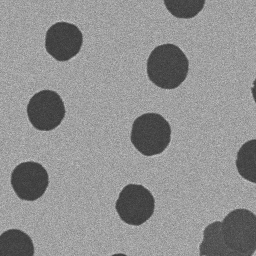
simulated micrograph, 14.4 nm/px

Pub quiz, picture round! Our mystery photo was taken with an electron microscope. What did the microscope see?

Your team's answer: holes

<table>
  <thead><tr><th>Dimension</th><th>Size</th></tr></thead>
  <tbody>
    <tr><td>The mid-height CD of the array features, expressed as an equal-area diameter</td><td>570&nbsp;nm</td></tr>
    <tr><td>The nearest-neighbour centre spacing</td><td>1030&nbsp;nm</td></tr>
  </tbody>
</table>